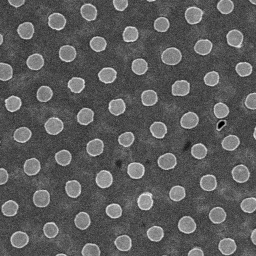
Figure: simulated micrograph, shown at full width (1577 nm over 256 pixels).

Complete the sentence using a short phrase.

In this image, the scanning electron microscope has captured a regular array of raised bodies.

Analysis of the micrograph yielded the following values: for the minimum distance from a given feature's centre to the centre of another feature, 201 nanometers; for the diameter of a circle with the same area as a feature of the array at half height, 99.8 nm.